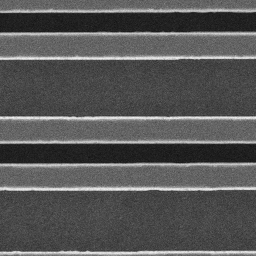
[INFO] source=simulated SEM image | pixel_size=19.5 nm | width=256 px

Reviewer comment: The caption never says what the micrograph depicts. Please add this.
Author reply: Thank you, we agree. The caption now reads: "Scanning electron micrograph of lines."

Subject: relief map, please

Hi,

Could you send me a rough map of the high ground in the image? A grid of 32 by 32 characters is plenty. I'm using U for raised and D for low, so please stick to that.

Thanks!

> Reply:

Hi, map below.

UUUUUUUUUUUUUUUUUUUUUUUUUUUUUUUU
UUUUUUUUUUUUUUUUUDUUUDDDDUDDDDDD
DDDDDDDDDDDDDDDDDDDDDDDDDDDDDDDD
DDDDDDDDDDDDDDDDDDDDDDDDDDDDDDDD
UUUUUUUUUUUUUUUUUUUUUUUUUUUUUUUU
UUUUUUUUUUUUUUUUUUUUUUUUUUUUUUUU
UUUUUUUUUUUUUUUUUUUUUUUUUUUUUUUU
DDDDDDDDDDDDDDDDDDDDDDDDDDDDDDDD
DDDDDDDDDDDDDDDDDDDDDDDDDDDDDDDD
DDDDDDDDDDDDDDDDDDDDDDDDDDDDDDDD
DDDDDDDDDDDDDDDDDDDDDDDDDDDDDDDD
DDDDDDDDDDDDDDDDDDDDDDDDDDDDDDDD
DDDDDDDDDDDDDDDDDDDDDDDDDDDDDDDD
DDDDDDDDDDDDDDDDDDDDDDDDDDDDDDDD
DDDDDDDDDDDDDDDDDDDDDDDDDDDDDDDD
UUUUUUUUUUUUUUUUUUUUUUUUUUUUUUUU
UUUUUUUUUUUUUUUUUUUUUUUUUUUUUUUU
UUUUUUUUUUUUUUUUUUUUUUUUUUUUUUUU
DDDDDDDDDDDDDDDDDDDDDDDDDDDDDDDD
DDDDDDDDDDDDDDDDDDDDDDDDDDDDDDDD
UUUUUUUUUUUUUUUUUUUUUUUUUUUUUUUU
UUUUUUUUUUUUUUUUUUUUUUUUUUUUUUUU
UUUUUUUUUUUUUUUUUUUUUUUUUUUUUUUU
UUUUUUUUUUUUUUUUUUUUUUUUUUUUUUUU
DDDDDDDDDDDDDDDDDDDDDDDDDDDDDDDD
DDDDDDDDDDDDDDDDDDDDDDDDDDDDDDDD
DDDDDDDDDDDDDDDDDDDDDDDDDDDDDDDD
DDDDDDDDDDDDDDDDDDDDDDDDDDDDDDDD
DDDDDDDDDDDDDDDDDDDDDDDDDDDDDDDD
DDDDDDDDDDDDDDDDDDDDDDDDDDDDDDDD
DDDDDDDDDDDDDDDDDDDDDDDDDDDDDDDD
DDDDDDDDDDDDDDDDDUUUUUUUUUUUUUUU